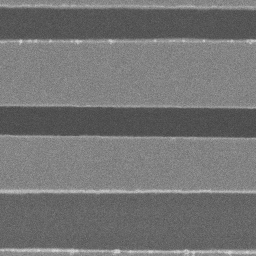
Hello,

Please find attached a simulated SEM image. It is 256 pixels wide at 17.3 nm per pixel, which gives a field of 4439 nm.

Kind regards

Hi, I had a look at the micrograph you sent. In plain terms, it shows lines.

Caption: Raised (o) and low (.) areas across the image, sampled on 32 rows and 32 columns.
oooooooooooooooooooooooooooooooo
................................
................................
................................
................................
oooooooooooooooooooooooooooooooo
oooooooooooooooooooooooooooooooo
oooooooooooooooooooooooooooooooo
oooooooooooooooooooooooooooooooo
oooooooooooooooooooooooooooooooo
oooooooooooooooooooooooooooooooo
oooooooooooooooooooooooooooooooo
oooooooooooooooooooooooooooooooo
...............................o
................................
................................
................................
oooooooooooooooooooooooooooooooo
oooooooooooooooooooooooooooooooo
oooooooooooooooooooooooooooooooo
oooooooooooooooooooooooooooooooo
oooooooooooooooooooooooooooooooo
oooooooooooooooooooooooooooooooo
oooooooooooooooooooooooooooooooo
................................
................................
................................
................................
................................
................................
................................
oooooooooooooooooooo.ooooo..o...